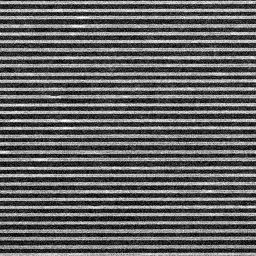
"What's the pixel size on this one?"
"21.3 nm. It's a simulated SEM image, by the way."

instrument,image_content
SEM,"parallel lines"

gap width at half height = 114 nanometres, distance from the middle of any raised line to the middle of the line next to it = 7.87 pixels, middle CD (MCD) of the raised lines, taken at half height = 53.2 nm